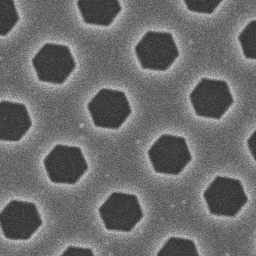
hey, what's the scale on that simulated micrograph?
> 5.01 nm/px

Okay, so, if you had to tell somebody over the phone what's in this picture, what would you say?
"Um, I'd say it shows a regular array of holes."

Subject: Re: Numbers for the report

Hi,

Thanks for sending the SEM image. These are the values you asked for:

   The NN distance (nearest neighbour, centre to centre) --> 0.355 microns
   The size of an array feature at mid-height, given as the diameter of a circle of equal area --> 204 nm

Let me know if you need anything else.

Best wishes